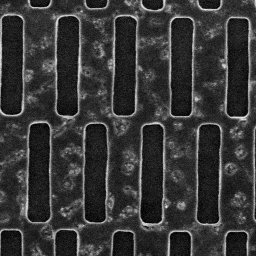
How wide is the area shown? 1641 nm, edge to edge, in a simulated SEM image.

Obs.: a regular array of holes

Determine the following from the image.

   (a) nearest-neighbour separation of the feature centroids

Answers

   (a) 56.4 px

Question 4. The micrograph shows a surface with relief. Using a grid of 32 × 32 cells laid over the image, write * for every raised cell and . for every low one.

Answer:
****..*****..*****..*****..*****
********************************
...****...****...*****..*****..*
...****...****...****...****...*
...****...****...****...****...*
...****...****...****...****...*
...****...****...****...****...*
...****...****...****...****...*
...****...****...****...****...*
...****...****...****...****...*
...****...****...****...****...*
...****...****...****...****...*
...****...****...****...****...*
...****...****...****...****...*
***************.******.******..*
****..*****..******.******.*****
****..*****..*****..*****...****
***...*****..*****..*****...****
****..*****..*****..*****..*****
****..*****..*****..*****..*****
****..*****..*****..*****...****
***...****...*****..*****...****
***...****...****...*****...****
***...****...*****..*****..*****
***...****...*****..*****..*****
***...****...*****..*****..*****
***...*****..****...*****..*****
****..*****..*****..*****..*****
********************************
...****...****...****...****...*
...****...****...****...****...*
...****...****...****...****...*